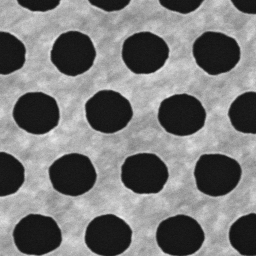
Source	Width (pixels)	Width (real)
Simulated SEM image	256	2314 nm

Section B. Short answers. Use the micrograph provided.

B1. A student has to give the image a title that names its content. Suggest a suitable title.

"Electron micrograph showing a regular array of holes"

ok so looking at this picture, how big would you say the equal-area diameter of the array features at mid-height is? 408 nm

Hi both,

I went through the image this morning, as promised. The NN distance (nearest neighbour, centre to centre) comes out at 0.626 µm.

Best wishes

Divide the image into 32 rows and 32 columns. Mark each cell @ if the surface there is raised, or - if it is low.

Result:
@@-----@@@@-----@@@@-----@@@@---
@@@@@@@@@@@@@@@@@@@@@@--@@@@@@--
@@@@@@@@@@@@@@@@@@@@@@@@@@@@@@@@
@@@@@@@@@@@@@@@@@@@@@@@@@@@@@@@@
--@@@@@----@@@@@----@@@@@----@@@
---@@@@-----@@@------@@@------@@
---@@@------@@@------@@@------@@
---@@@------@@@------@@@------@@
---@@@@----@@@@@----@@@@@----@@@
@@@@@@@@@-@@@@@@@@@@@@@@@@@@@@@@
@@@@@@@@@@@@@@@@@@@@@@@@@@@@@@@@
@@@@-@@@@@@@---@@@@@@@@@@@@@@@@-
@@-----@@@@-----@@@@-----@@@@---
@@-----@@@@-----@@@@-----@@@@---
@@-----@@@@------@@@------@@@---
@@-----@@@@-----@@@@------@@@---
@@@---@@@@@@@--@@@@@@----@@@@@--
@@@@@@@@@@@@@@@@@@@@@@@@@@@@@@@@
@@@@@@@@@@@@@@@@@@@@@@@@@@@@@@@@
--@@@@@@---@@@@@----@@@@@---@@@@
---@@@@-----@@@------@@@@-----@@
---@@@------@@@------@@@------@@
---@@@------@@@------@@@------@@
--@@@@@----@@@@@----@@@@@----@@@
-@@@@@@@@-@@@@@@@@@@@@@@@@-@@@@@
@@@@@@@@@@@@@@@@@@@@@@@@@@@@@@@@
@@@@@@@@@@@@@@@@@@@@@@@@@@@@@@@@
@@@----@@@@@---@@@@@@---@@@@@@--
@@-----@@@@-----@@@@-----@@@@---
@@------@@@-----@@@-------@@@---
@@------@@@-----@@@@-----@@@@---
@@@---@@@@@@---@@@@@----@@@@@@--